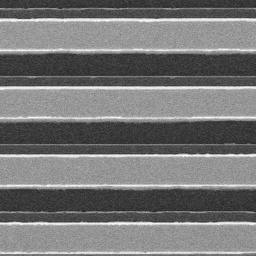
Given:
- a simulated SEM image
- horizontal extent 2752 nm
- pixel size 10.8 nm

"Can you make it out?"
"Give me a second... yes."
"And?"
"lines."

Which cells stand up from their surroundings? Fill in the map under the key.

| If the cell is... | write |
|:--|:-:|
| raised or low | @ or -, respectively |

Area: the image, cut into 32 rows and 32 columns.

--------------------------------
--------------------------------
@@@@@@@@@@@@@@@@@@@@@@@@@@@@@@@@
@@@@@@@@@@@@@@@@@@@@@@@@@@@@@@@@
@@@@@@@@@@@@@@@@@@@@@@@@@@@@@@@@
@@@@@@@@@@@@@@@@@@@@@@@@@@@@@@@@
--------------------------------
--------------------------------
--------------------------------
--------------------------------
--------------------------------
@@@@@@@@@@@@@@@@@@@@@@@@@@@@@@@@
@@@@@@@@@@@@@@@@@@@@@@@@@@@@@@@@
@@@@@@@@@@@@@@@@@@@@@@@@@@@@@@@@
@@@@@@@@@@@@@@@@@@@@@@@@@@@@@@@@
--------------------------------
--------------------------------
--------------------------------
--------------------------------
@@@@@@@@@@@@@@@@@@@@@@@@@@@@@@@@
@@@@@@@@@@@@@@@@@@@@@@@@@@@@@@@@
@@@@@@@@@@@@@@@@@@@@@@@@@@@@@@@@
@@@@@@@@@@@@@@@@@@@@@@@@@@@@@@@@
--------------------------------
--------------------------------
--------------------------------
--------------------------------
--------------------------------
@@@@@@@@@@@@@@@@@@@@@@@@@@@@@@@@
@@@@@@@@@@@@@@@@@@@@@@@@@@@@@@@@
@@@@@@@@@@@@@@@@@@@@@@@@@@@@@@@@
@@@@@@@@@@@@@@@@@@@@@@@@@@@@@@@@